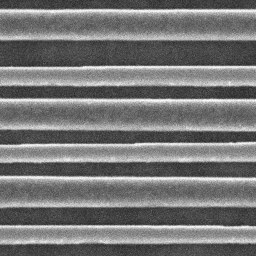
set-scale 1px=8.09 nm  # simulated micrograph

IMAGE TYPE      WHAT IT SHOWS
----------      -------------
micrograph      lines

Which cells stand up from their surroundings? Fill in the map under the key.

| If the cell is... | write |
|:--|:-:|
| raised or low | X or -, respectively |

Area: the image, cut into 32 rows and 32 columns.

--------------------------------
XXXXXXXXXXXXXXXXXXXXXXXXXXXXXXXX
XXXXXXXXXXXXXXXXXXXXXXXXXXXXXXXX
XXXXXXXXXXXXXXXXXXXXXXXXXXXXXXXX
XXXXXXXXXXXXXXXXXXXXXXXXXXXXXXXX
--------------------------------
--------------------------------
--------------------------------
XXXXXXXXXXXXXXXXXXXXXXXXXXXXXXXX
XXXXXXXXXXXXXXXXXXXXXXXXXXXXXXXX
--------------------------------
--------------------------------
XXXXXXXXXXXXXX--XXX-XX---XXXX---
XXXXXXXXXXXXXXXXXXXXXXXXXXXXXXXX
XXXXXXXXXXXXXXXXXXXXXXXXXXXXXXXX
XXXXXXXXXXXXXXXXXXXXXXXXXXXXXXXX
--------------------------------
--------------------------------
XXXXXXXXXXXXXXXXXXXXXXXXXXXXXXXX
XXXXXXXXXXXXXXXXXXXXXXXXXXXXXXXX
--------------------------------
--------------------------------
XXXXXXXXXXXXXXXXXXXXXXXXXXXXXXXX
XXXXXXXXXXXXXXXXXXXXXXXXXXXXXXXX
XXXXXXXXXXXXXXXXXXXXXXXXXXXXXXXX
XXXXXXXXXXXXXXXXXXXXXXXXXXXXXXXX
--------------------------------
--------------------------------
XXXXXXXXXXXXXXXXXXXXXXXXXXXXXXXX
XXXXXXXXXXXXXXXXXXXXXXXXXXXXXXXX
--------------------------------
--------------------------------